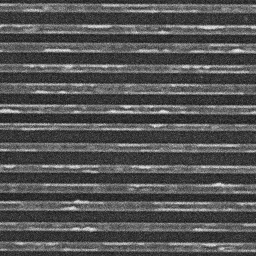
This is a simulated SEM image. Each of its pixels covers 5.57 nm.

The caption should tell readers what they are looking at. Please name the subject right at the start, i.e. parallel lines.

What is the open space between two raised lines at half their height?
62.6 nanometres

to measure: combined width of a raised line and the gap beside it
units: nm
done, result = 111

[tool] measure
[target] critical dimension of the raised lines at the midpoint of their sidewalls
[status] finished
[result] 46.6 nm